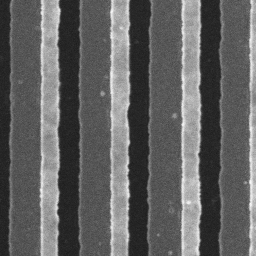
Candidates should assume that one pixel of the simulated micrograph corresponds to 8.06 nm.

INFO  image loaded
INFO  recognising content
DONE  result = lines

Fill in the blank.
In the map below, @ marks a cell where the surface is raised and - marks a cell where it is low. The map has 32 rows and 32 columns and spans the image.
-@@@@@@---@@@@@@---@@@@@@---@@@@
-@@@@@@---@@@@@@---@@@@@@---@@@@
-@@@@@@---@@@@@@---@@@@@@---@@@@
-@@@@@@---@@@@@@---@@@@@@---@@@@
-@@@@@@---@@@@@@---@@@@@@---@@@@
-@@@@@@---@@@@@@---@@@@@@--@@@@@
-@@@@@@---@@@@@@---@@@@@@--@@@@@
-@@@@@@---@@@@@@---@@@@@@--@@@@@
-@@@@@@---@@@@@@---@@@@@@---@@@@
-@@@@@@---@@@@@@---@@@@@@---@@@@
-@@@@@@---@@@@@@---@@@@@@---@@@@
-@@@@@@---@@@@@@---@@@@@@---@@@@
-@@@@@@---@@@@@@---@@@@@@---@@@@
-@@@@@@---@@@@@@---@@@@@@--@@@@@
-@@@@@@---@@@@@@---@@@@@@---@@@@
-@@@@@@---@@@@@@---@@@@@@---@@@@
-@@@@@@---@@@@@@---@@@@@@---@@@@
-@@@@@@---@@@@@@---@@@@@@---@@@@
-@@@@@@---@@@@@@---@@@@@@---@@@@
-@@@@@@---@@@@@@---@@@@@@---@@@@
-@@@@@@---@@@@@@---@@@@@@---@@@@
-@@@@@@---@@@@@@---@@@@@@---@@@@
-@@@@@@---@@@@@@---@@@@@@--@@@@@
-@@@@@@---@@@@@@--@@@@@@@--@@@@@
-@@@@@@---@@@@@@---@@@@@@---@@@@
-@@@@@@---@@@@@@---@@@@@@---@@@@
-@@@@@@---@@@@@@---@@@@@@---@@@@
-@@@@@@---@@@@@@---@@@@@@---@@@@
-@@@@@@---@@@@@@--@@@@@@@---@@@@
-@@@@@@---@@@@@@--@@@@@@@--@@@@@
-@@@@@@---@@@@@@---@@@@@@--@@@@@
-@@@@@@---@@@@@@---@@@@@@--@@@@@